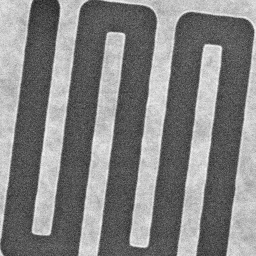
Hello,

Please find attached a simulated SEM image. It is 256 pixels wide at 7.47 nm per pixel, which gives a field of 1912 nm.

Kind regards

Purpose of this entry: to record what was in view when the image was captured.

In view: groups of lines, slits or small figures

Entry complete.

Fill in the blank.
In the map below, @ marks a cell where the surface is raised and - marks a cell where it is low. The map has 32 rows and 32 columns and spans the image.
@@@@---@@@------@@@@@@@@@@@@@@@@
@@@@----@@---------@@@@--@@@@@@@
@@@@---@@@----------@@---------@
@@@----@@@----------@@----------
@@@----@@----@@@---@@@----------
@@@----@@----@@----@@@----------
@@@----@@----@@----@@@---@@@----
@@@----@@----@@----@@----@@@----
@@@----@@----@@----@@----@@----@
@@@----@@----@@----@@----@@----@
@@@---@@@----@@----@@----@@----@
@@----@@@---@@@----@@----@@----@
@@----@@----@@@----@@----@@----@
@@----@@----@@----@@@---@@@----@
@@----@@----@@----@@@---@@@----@
@@----@@----@@----@@----@@@---@@
@@----@@----@@----@@----@@----@@
@@---@@@----@@----@@----@@----@@
@@---@@@----@@----@@----@@----@@
@----@@@---@@@----@@----@@----@@
@----@@----@@@---@@@----@@----@@
@----@@----@@----@@@----@@----@@
@----@@----@@----@@----@@@---@@@
@----@@----@@----@@----@@@---@@@
@----@@----@@----@@----@@----@@@
@----@@----@@----@@----@@----@@@
----@@@----@@----@@----@@----@@@
----@@@---@@@----@@----@@----@@@
----@@----@@@----@@----@@----@@@
----------@@----@@@---@@@----@@@
----------@@-----@----@@@----@@@
----------@@----------@@----@@@@